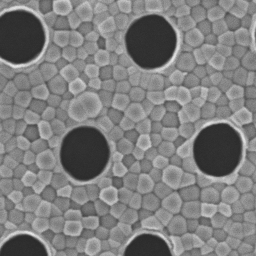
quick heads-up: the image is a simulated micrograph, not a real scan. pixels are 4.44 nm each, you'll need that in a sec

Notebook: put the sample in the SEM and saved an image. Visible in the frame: holes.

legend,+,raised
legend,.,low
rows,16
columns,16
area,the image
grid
++++++++++++++++
...+++++...+++++
...+++++...+++++
..++++++...+++++
++++++++++++++++
++++++++++++++++
++++++++++++++++
++++++++++++++++
++++..++++++...+
++++...+++++...+
++++...+++++...+
++++++++++++++++
++++++++++++++++
++++++++++++++++
++++++++++++++++
...+++++...+++++